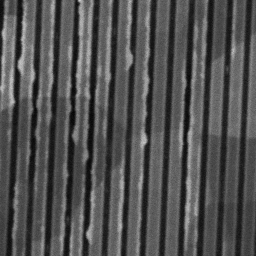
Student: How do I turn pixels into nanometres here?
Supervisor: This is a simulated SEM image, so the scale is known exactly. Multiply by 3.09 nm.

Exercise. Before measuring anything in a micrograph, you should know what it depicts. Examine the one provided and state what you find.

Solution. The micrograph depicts parallel lines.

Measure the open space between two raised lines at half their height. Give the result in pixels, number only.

7.38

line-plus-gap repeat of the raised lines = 0.0589 micrometres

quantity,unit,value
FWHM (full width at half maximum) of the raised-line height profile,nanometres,37